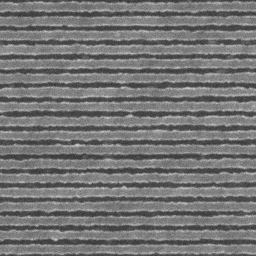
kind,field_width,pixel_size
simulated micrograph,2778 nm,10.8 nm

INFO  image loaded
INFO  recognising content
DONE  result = parallel lines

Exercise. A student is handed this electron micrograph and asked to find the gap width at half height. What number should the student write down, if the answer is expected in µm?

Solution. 0.0651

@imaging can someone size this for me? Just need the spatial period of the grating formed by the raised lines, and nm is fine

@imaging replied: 155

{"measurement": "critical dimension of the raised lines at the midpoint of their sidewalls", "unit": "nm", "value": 86.8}